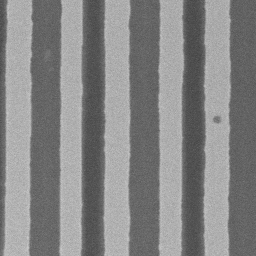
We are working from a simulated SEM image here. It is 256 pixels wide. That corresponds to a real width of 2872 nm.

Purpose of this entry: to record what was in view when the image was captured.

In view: lines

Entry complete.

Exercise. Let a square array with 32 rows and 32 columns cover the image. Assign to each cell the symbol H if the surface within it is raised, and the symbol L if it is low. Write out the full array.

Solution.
LHHHLLLLHHLLLHHHLLLLHHHLLLHHHLLL
LHHHLLLLHHLLLHHHLLLLHHHLLLHHHLLL
LHHHLLLLHHLLLHHHLLLLHHHLLLHHHLLL
LHHHLLLLHHLLLHHHLLLLHHHLLLHHHLLL
LHHHLLLLHHLLLHHHLLLLHHHLLLHHHLLL
LHHHLLLLHHLLLHHHLLLLHHHLLLHHHLLL
LHHHLLLLHHLLLHHHLLLLHHHLLLHHHLLL
LHHHLLLLHHLLLHHHLLLLHHHLLLHHHLLL
LHHHLLLLHHLLLHHHLLLLHHHLLLHHHLLL
LHHHLLLLHHLLLHHHLLLLHHHLLLHHHLLL
LHHHLLLLHHLLLHHHLLLLHHHLLLHHHLLL
LHHHLLLLHHLLLHHHLLLLHHHLLLHHHLLL
LHHHLLLLHHLLLHHHLLLLHHHLLLHHHLLL
LHHHLLLLHHLLLHHHLLLLHHHLLLHHHLLL
LHHHLLLLHHLLLHHHLLLLHHHLLLHHHLLL
LHHHLLLLHHLLLHHHLLLLHHHLLLHHHLLL
LHHHLLLLHHLLLHHHLLLLHHHLLLHHHLLL
LHHHLLLLHHLLLHHHLLLLHHHLLLHHHLLL
LHHHLLLHHHLLLHHHLLLLHHHLLLHHHLLL
LHHHLLLHHHLLLHHHLLLLHHHLLLHHHLLL
LHHHLLLLHHLLLHHHLLLLHHHLLLHHHLLL
LHHHLLLLHHLLLHHHLLLLHHHLLLHHHLLL
LHHHLLLLHHLLLHHHLLLLHHHLLLHHHLLL
LHHHLLLLHHLLLHHHLLLLHHHLLLHHHLLL
LHHHLLLLHHLLLHHHLLLLHHHLLLHHHLLL
LHHHLLLLHHLLLHHHLLLLHHHLLLHHHLLL
LHHHLLLLHHLLLHHHLLLLHHHLLLHHHLLL
LHHHLLLLHHLLLHHHLLLLHHHLLLHHHLLL
LHHHLLLLHHLLLHHHLLLLHHHLLLHHLLLL
LHHHLLLLHHLLLHHHLLLLHHHLLLHHHLLL
LHHHLLLHHHLLLHHHLLLLHHHLLLHHHLLL
LHHHLLLHHHLLLHHHLLLLHHHLLLHHHLLL